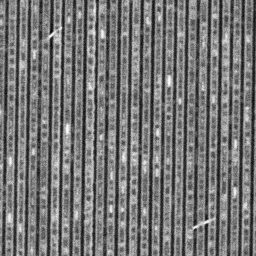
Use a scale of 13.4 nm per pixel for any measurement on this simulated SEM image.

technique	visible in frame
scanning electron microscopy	parallel lines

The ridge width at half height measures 97.5 nm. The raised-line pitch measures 0.151 um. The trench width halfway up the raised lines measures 0.0605 microns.